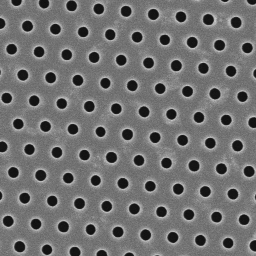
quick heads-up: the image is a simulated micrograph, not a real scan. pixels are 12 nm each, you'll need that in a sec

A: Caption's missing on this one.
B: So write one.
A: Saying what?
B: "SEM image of a regular array of holes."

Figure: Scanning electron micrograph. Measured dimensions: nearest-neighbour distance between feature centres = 329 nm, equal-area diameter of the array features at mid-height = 131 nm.